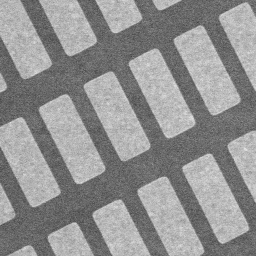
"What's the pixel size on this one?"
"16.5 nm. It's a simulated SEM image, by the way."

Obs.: groups of lines, slits or small figures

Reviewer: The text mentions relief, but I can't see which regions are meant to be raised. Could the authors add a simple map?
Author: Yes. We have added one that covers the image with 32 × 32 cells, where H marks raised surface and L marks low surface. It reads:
HHHLLHHHHHLLHHHHHLLHHHLLLLLLLLHL
HHHLLLHHHHLLLHHHHLLLLLLLLLLLHHHH
HHHHLLHHHHHLLHHHHLLLLLLLLLLLHHHH
HHHHLLLHHHHLLLHHLLLLLLLLHLLLHHHH
HHHHHLLHHHHHLLLLLLLLLLHHHHLLHHHH
LHHHHLLLHHHHLLLLLLLLLLHHHHHLLHHH
LHHHHHLLHHLLLLLLLLHHLLHHHHHLLHHH
LLHHHHLLLLLLLLLLLHHHLLLHHHHHLLHH
LLHHHHLLLLLLLLLLHHHHHLLHHHHHLLHH
LLLHLLLLLLLLLHLLLHHHHLLLHHHHHLLH
HLLLLLLLLLLHHHHLLHHHHHLLHHHHHLLL
LLLLLLLLLLLHHHHLLLHHHHLLLHHHHHLL
LLLLLLLHHLLHHHHHLLHHHHHLLHHHHHLL
LLLLLHHHHLLLHHHHLLLHHHHHLLHHHLLL
LLLLLHHHHHLLHHHHHLLHHHHHLLLLLLLL
LHHLLLHHHHLLLHHHHLLLHHHHLLLLLLLL
HHHHLLHHHHHLLHHHHHLLHHHLLLLLLLLH
HHHHLLLHHHHLLLHHHHLLLLLLLLLLLHHH
HHHHHLLHHHHHLLHHHHHLLLLLLLLLLHHH
LHHHHLLLHHHHLLLHHLLLLLLLLHLLLHHH
LHHHHHLLHHHHHLLLLLLLLLLHHHHLLLHH
LLHHHHLLLHHHHLLLLLLLLLLHHHHHLLHH
LLHHHHHLLHHLLLLLLLLLHLLHHHHHLLLH
LLLHHHHLLLLLLLLLLLHHHHLLHHHHHLLH
HLLHHHHLLLLLLLLLLHHHHHLLHHHHHLLL
HLLLHLLLLLLLLLHLLLHHHHHLLHHHHHLL
HHLLLLLLLLLLHHHHLLHHHHHLLHHHHHLL
HLLLLLLLLLLLHHHHLLLHHHHHLLHHHHHL
LLLLLLLLHHLLHHHHHLLHHHHHLLLHHHHL
LLLLLLHHHHLLLHHHHHLLHHHHHLLHHHLL
LLLLLLHHHHHLLHHHHHLLHHHHHLLLLLLL
LLHHLLLHHHHLLLHHHHHLLHHHHLLLLLLL